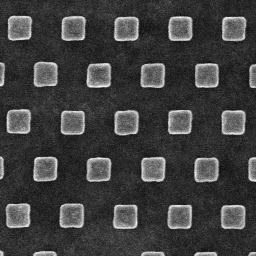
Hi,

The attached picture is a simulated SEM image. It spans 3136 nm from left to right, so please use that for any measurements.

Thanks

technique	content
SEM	a regular array of raised bodies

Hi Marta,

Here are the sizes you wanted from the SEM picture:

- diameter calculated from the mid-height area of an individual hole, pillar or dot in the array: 316 nanometres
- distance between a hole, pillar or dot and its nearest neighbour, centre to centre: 650 nm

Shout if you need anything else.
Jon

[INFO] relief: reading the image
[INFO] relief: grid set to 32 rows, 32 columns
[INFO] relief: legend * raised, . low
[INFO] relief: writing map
................................
................................
.***....***....**....***....***.
.***....***...***....***....***.
.***....***...***....***....***.
................................
................................
................................
....***....***....***...***....*
....***....***....***...***....*
....***....***....**....***....*
................................
................................
................................
.***....**....***....***....***.
.***....***...***....***....***.
.**.....**.....**....***....**..
................................
................................
................................
....***....***....***...***....*
....***....***....**....***....*
...........**.....**.....**....*
................................
................................
................................
.***....**....***....***....***.
.***....**....***....***....***.
...............*......*.....**..
................................
................................
................................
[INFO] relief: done